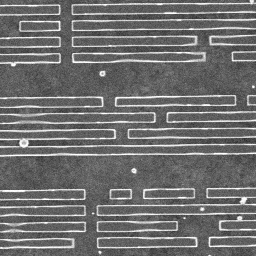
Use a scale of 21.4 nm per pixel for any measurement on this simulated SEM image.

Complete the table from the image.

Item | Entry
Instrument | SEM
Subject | groups of lines, slits or small figures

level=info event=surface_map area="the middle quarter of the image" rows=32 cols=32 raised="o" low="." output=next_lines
................................
................................
.........o......................
................................
................................
................................
................................
................................
oooooooooo...ooooooooooooooooooo
oooooooooo...ooooooooooooooooooo
oooooooooo......................
................................
ooooooooooooooooooooooo...oooooo
ooooooooooooooooooooooo...oooooo
ooooooooooooo...................
................................
.....ooooooo....oooooooooooooooo
ooooooooooooo...oooooooooooooooo
ooooooooooooo...................
................................
.....................ooooooooooo
oooooooooooooooooooooooooooooooo
oooooooooooooooo..o......oooooo.
................................
................................
................................
.................o..............
................................
................................
................................
................................
.............oooo...oooooooooooo